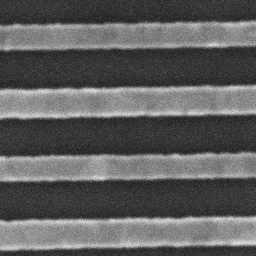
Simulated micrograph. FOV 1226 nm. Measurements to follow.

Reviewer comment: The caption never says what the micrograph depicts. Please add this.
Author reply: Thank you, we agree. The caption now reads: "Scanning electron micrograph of lines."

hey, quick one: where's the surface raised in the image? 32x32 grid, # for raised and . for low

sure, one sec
................................
................................
................................
################################
################################
################################
................................
................................
................................
................................
................................
################################
################################
################################
##########..##..................
................................
................................
................................
................................
...........####.################
################################
################################
#######..#......................
................................
................................
................................
................................
..............##################
################################
################################
################################
................................